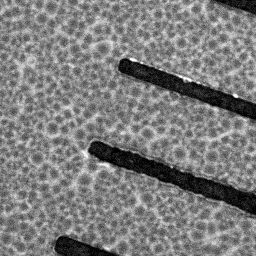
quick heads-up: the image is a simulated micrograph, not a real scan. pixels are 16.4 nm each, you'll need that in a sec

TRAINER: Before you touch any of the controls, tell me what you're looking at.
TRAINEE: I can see one or a few lines or trenches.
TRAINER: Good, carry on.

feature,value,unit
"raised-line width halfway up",288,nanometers